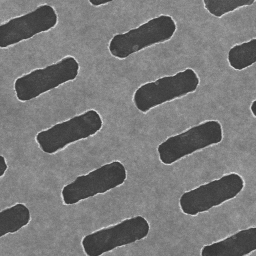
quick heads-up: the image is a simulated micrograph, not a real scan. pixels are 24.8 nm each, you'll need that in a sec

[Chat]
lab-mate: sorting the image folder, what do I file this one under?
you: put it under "holes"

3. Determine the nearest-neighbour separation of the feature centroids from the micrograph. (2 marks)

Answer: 1410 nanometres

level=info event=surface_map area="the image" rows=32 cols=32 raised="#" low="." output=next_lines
############.#############.....#
####...###################...###
#......############...##########
......###########.....##########
....##########.......###########
..############.....###########..
##############...############...
########.####################...
#####.....###################..#
###.......###########....#######
##......##########.......#######
##....###########.......########
#################....###########
#################..############.
##########..####################
#######......############..#####
#####.......###########.....####
#####.....###########.......####
#####...############.....#######
####################...#########
.############..#################
.##########.....################
#########.......###########...##
########......###########.....##
########....###########......###
#######################....#####
....###################..#######
....############..##############
...##########......#############
###########.......###########...
##########......###########.....
###########..############......#